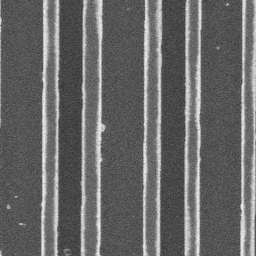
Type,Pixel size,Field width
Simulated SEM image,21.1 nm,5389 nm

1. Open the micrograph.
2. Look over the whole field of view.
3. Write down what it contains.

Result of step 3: lines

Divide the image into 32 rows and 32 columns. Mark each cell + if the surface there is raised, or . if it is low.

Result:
.....++....++.....++...++.....++
.....++...+++.....++...++.....++
.....++...+++.....++...++.....++
......+...+++.....++...++.....++
......+...+++.....++...++.....++
.....++...+++.....++...++.....++
.....++...+++.....++...++.....++
.....++...+++.....++...++.....++
.....++...+++.....++...++.....++
.....++...+++.....++...++.....++
.....++...+++.....++...++.....++
.....++...+++.....++...++.....++
.....++...+++.....++...++.....++
.....++...+++.....++...++.....++
.....++...++......++...++.....++
.....++...++......++...++.....++
.....++...++......++...++.....++
.....++...++......++...++.....++
.....++...++......++...++.....++
.....++...++......++...++.....++
.....++...++......++...++.....++
.....++...++......++...++.....++
.....++...++......++...++.....++
.....++...++......++...++.....++
.....++...++......++...++.....++
.....++...++......++...++.....++
.....++...++......++...++.....++
.....++...++......++...++.....++
.....++...++......++...++.....++
.....++...++......++...++.....++
.....++...++......++...++.....++
.....++...++......++...++.....++